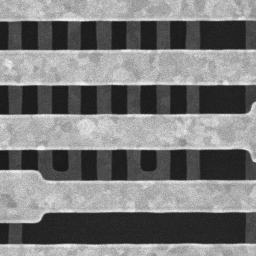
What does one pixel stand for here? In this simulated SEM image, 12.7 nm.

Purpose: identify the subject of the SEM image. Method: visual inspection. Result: wiring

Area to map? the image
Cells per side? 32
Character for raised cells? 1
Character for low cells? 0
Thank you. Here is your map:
11111111111111111111111111111111
11111111111111111111111111111111
11111111111111111111111111111111
00000000000000000000000000000000
00000000000000000000000000000000
00000000000000000000000000000000
11111111111111111111111111111111
11111111111111111111111111111111
11111111111111111111111111111111
11111111111111111111111111111111
11111111111111111111111111111111
00000000000000000000000000000000
00000000000000000000000000000000
00000000000000000000000000000001
11111111111111111111111111111111
11111111111111111111111111111111
11111111111111111111111111111111
11111111111111111111111111111111
11111111111111111111111111111111
00000000000000000000000000000001
00000000000000000000000000000000
11111000000000000000000000000000
11111100000000000000000000000000
11111111111111111111111111111111
11111111111111111111111111111111
11111111111111111111111111111111
11111111111111000011110001111010
11111000000000000000000000000000
00000000000000000000000000000000
00000000000000000000000000000000
00000000000000000000001110000110
11111111111111111111111111111111